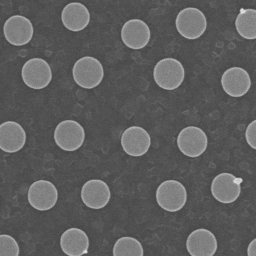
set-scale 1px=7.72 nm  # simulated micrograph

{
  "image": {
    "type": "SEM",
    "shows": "a regular array of raised bodies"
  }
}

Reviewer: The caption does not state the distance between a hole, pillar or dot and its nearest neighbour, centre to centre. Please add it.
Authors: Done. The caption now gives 426 nanometers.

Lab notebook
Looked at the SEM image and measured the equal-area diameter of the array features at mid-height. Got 230 nm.